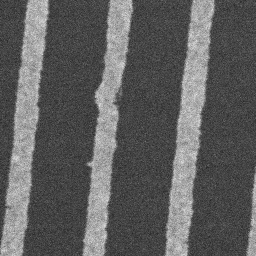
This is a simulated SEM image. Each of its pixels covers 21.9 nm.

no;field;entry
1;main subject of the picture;one or a few lines or trenches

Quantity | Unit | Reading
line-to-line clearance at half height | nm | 1350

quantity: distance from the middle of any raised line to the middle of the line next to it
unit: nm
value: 1790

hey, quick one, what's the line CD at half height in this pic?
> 433 nanometers